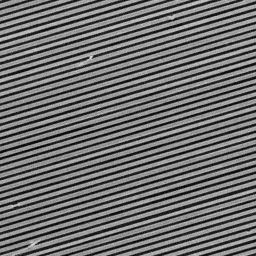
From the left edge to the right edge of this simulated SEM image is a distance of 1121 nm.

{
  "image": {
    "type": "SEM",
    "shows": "parallel lines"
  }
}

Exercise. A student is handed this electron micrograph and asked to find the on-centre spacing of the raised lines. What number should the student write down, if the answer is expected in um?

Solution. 0.0286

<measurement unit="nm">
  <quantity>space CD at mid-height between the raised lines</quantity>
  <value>12.6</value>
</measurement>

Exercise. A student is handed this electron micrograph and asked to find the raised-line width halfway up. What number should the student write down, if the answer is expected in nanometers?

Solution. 17.4